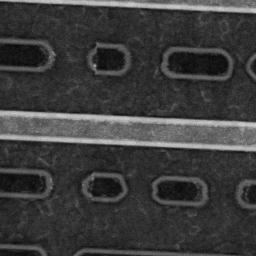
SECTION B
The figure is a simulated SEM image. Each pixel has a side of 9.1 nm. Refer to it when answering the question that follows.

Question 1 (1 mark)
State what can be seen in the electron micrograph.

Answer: one or a few lines or trenches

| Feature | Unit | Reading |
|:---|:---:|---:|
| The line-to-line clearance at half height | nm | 412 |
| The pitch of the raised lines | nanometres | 588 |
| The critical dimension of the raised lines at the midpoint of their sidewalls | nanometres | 218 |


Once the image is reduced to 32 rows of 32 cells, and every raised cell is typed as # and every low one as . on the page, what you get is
...............#################
................................
................................
................................
................................
#####...........................
######......####.....#######....
######.....#####.....########..#
...##.......####.....########..#
........................####....
................................
................................
................................
................................
########........................
#############################...
################################
..........######################
...............................#
................................
................................
###.............................
######.....####.....####........
######.....#####...#######....##
...........####....#######....##
..............................##
................................
................................
................................
................................
................................
#####.....####..................